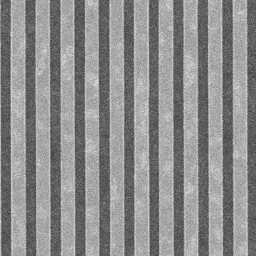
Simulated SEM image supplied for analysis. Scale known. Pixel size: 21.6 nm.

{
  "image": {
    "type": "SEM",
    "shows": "parallel lines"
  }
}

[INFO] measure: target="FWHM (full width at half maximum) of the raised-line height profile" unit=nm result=289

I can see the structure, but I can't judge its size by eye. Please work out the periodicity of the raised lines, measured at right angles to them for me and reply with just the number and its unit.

533 nm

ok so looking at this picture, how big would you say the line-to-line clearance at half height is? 235 nanometres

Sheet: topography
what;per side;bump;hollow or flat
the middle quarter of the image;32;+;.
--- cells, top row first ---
++...++++..++++...+++...+++...++
++...++++..++++...+++...+++...++
++...++++...+++...+++...+++...++
++...++++...+++...+++...+++...++
++...++++...+++...+++...+++...++
++...++++...+++...+++...+++...++
++...++++...+++...+++...+++...++
++...++++...+++...+++...+++...++
++...++++...+++...+++...+++...++
++...++++...+++...+++...+++...++
++...++++...+++...+++...+++...++
++...++++...+++...+++...+++...++
++...++++...+++...+++...+++...++
+++..++++...+++...+++...+++...++
+++..++++...+++...+++...+++...++
+++..++++...+++...+++...+++...++
+++..++++...+++...+++...+++...++
+++..++++...+++...+++...+++...++
+++..++++...+++...+++...+++...++
+++..++++...+++...+++...+++...++
+++..++++...+++...+++...+++...++
+++..++++...+++...+++...+++...++
+++..++++...+++...+++...+++...++
+++..++++...+++...+++...+++...++
+++..++++...+++...+++...+++...++
+++...+++...+++...+++...+++...++
+++...+++...+++...+++...+++...++
+++...+++...+++...+++...+++...++
+++...+++...+++...+++...+++...++
+++...+++...+++...+++...+++...++
+++...+++...+++...+++...+++...++
+++...+++...+++...+++...+++...++